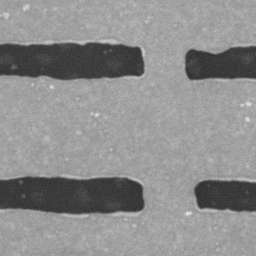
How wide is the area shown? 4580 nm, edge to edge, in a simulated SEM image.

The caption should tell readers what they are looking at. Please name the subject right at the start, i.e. holes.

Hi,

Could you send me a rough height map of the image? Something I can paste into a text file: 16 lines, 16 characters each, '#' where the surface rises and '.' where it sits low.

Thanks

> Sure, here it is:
################
################
################
.........###....
.........###....
################
################
################
################
################
################
.........###....
.........###....
####.###########
################
################